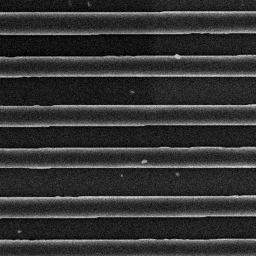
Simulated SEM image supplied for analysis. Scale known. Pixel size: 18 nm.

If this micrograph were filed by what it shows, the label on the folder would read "lines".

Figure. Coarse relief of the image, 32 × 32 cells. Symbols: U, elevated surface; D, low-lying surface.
DDDDDDDDDDDDDDDDDDDDDDDDDDDDDDDD
DDDDDDDDDDDDDDDDDDDDDUUUUUUUUUUU
UUUUUUUUUUUUUUUUUUUUUUUUUUUUUUUU
UUUUUUUUUUUUUUUUUUUUUUUUUUUUUUUU
DDDDDDDDDDDDDDDDDDDDDDDDDDDDDDDD
DDDDDDDDDDDDDDDDDDDDDDDDDDDDDDDD
DDDDDDDDDDDDDDDDDDDDDDDDDDDDDDDD
UUUUUUUUUUUUUUUUUUUUUUUUUUUUUUUU
UUUUUUUUUUUUUUUUUUUUUUUUUUUUUUUU
UUUUUUUUUUUUUUUUUUUUUUUUUUUUUUUU
DDDDDDDDDDDDDDDDDDDDDDDDDDDDDDDD
DDDDDDDDDDDDDDDDDDDDDDDDDDDDDDDD
DDDDDDDDDDDDDDDDDDDDDDDDDDDDDDDD
UUUUUUUUUUUUUUUUUUUUUUUUUUUUUUUU
UUUUUUUUUUUUUUUUUUUUUUUUUUUUUUUU
UUUUUUUUUUUUUUUUUUUUUUUUUUUUUUUU
DDDDDDDDDDDDDDDDDDDDDDDDDDDDDDDD
DDDDDDDDDDDDDDDDDDDDDDDDDDDDDDDD
DDDDDDDDDDDDDDDDDDDDUDDDUUUUDDUU
UUUUUUUUUUUUUUUUUUUUUUUUUUUUUUUU
UUUUUUUUUUUUUUUUUUUUUUUUUUUUUUUU
DDDDDDDDDDDDDDDDDDDDDDDDDDDDDDDD
DDDDDDDDDDDDDDDDDDDDDDDDDDDDDDDD
DDDDDDDDDDDDDDDDDDDDDDDDDDDDDDDD
DDDDDDDDDDDDDDDDDDDDDDDDDDDDDDDD
UUUUUUUUUUUUUUUUUUUUUUUUUUUUUUUU
UUUUUUUUUUUUUUUUUUUUUUUUUUUUUUUU
DDDDDDDDDDDDDDDDDDDDDDDDDDDDDDDD
DDDDDDDDDDDDDDDDDDDDDDDDDDDDDDDD
DDDDDDDDDDDDDDDDDDDDDDDDDDDDDDDD
UUUUUUUUUUUUUUUUUUUUUUUUUUUUUUUU
UUUUUUUUUUUUUUUUUUUUUUUUUUUUUUUU